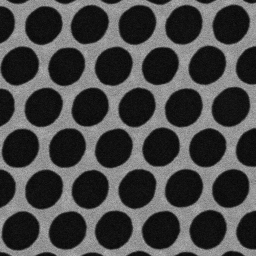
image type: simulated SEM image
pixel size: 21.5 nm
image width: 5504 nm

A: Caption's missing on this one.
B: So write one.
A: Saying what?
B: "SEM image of a regular array of holes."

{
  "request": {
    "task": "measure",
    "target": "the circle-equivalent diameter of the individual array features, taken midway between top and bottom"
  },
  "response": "824 nm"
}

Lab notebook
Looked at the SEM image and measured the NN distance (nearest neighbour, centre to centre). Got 46.7 px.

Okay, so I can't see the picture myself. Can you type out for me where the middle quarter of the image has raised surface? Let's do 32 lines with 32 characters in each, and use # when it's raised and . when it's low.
.....###.........###.........##.
.....###.........##.........###.
.....###.........###........###.
....####........####.......#####
...######......######.....######
.###########.###################
#####....########....########...
####......#####.......#####.....
###........###.........###......
##.........###.........###......
##.........###.........##.......
##.........##..........##.......
##.........###........###.......
##........####........####......
###......######......#####......
####...#########...########....#
....########...#######.....#####
.....#####......#####.......####
.....####........###.........###
.....###.........###.........###
......##.........###.........##.
.....###.........##..........##.
.....###.........###.........##.
.....###........####........####
....#####......######......#####
...######.....########...#######
######..#########...#########...
####......######......#####.....
###........####........###......
##.........###.........###......
##.........###.........##.......
##.........##..........##.......